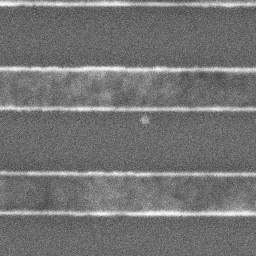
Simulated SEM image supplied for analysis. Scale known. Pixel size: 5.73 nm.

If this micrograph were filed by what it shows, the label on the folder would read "lines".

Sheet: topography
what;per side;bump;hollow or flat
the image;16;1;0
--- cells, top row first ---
0000000000000000
0000000000000000
0000000000000000
0000000000000000
1111111111111111
1111111111111111
1111111111111111
0000000000000000
0000000000000000
0000000000000000
0000000000000000
1111111111111111
1111111111111111
0000000000000000
0000000000000000
0000000000000000